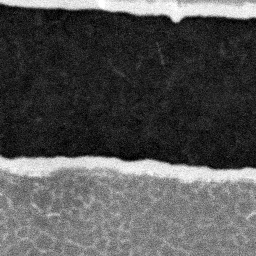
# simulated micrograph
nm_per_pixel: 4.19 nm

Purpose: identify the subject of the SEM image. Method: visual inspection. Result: one or a few lines or trenches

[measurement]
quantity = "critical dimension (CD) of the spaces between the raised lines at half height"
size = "672 nanometers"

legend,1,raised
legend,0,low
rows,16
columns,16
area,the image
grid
0000000001111111
0000000000000000
0000000000000000
0000000000000000
0000000000000000
0000000000000000
0000000000000000
0000000000000000
0000000000000000
0000000000000000
1111111111000000
1111111111111111
1111111111111111
1111111111111111
1111111111111111
1111111111111111